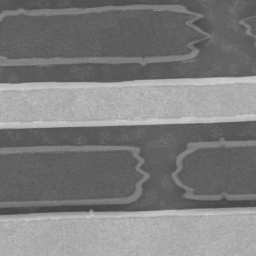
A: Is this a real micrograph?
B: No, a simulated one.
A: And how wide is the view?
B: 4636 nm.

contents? one or a few lines or trenches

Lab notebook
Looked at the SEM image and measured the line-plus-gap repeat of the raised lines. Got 1270 nanometers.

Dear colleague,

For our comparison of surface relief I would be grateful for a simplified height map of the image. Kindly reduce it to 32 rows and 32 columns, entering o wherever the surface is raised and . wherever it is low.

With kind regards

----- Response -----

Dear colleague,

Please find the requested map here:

................................
.......ooooooooooooooooo........
oooooooooooooooooooooooo.......o
ooooooooooooooooooooooooo......o
oooooooooooooooooooooooooo......
oooooooooooooooooooooooo........
oooooooooooooooooooooooo........
oooooooooooooo..oooo............
................................
................................
.............ooooooooooooooooooo
oooooooooooooooooooooooooooooooo
oooooooooooooooooooooooooooooooo
oooooooooooooooooooooooooooooooo
oooooooooooooooooooooooooooooooo
ooooooooo.......................
................................
................................
...............o........oooooooo
ooooooooooooooooo......ooooooooo
oooooooooooooooooo....oooooooooo
oooooooooooooooooo....oooooooooo
oooooooooooooooooo....oooooooooo
ooooooooooooooooo......ooooooooo
ooooooooooooooooo.......oooooooo
ooo.............................
..........................oooooo
oooooooooooooooooooooooooooooooo
oooooooooooooooooooooooooooooooo
oooooooooooooooooooooooooooooooo
oooooooooooooooooooooooooooooooo
oooooooooooooooooooooooooooooooo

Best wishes